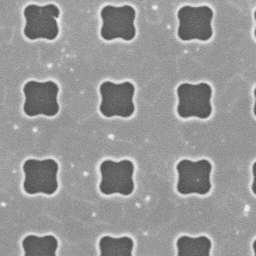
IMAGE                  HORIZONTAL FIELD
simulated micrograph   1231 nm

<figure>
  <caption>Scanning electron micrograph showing a regular array of holes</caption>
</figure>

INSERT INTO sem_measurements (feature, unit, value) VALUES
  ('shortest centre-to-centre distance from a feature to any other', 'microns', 0.368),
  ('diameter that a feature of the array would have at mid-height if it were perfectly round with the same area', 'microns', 0.189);